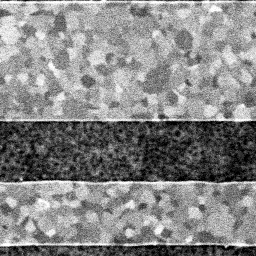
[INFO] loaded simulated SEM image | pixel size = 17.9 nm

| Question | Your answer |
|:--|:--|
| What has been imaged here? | one or a few lines or trenches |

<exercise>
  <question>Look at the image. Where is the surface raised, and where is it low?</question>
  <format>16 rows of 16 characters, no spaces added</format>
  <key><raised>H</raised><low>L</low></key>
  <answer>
HHHHHHHHHHHHHHHH
HHHHHHHHHHHHHHHH
HHHHHHHHHHHHHHHH
HHHHHHHHHHHHHHHH
HHHHHHHHHHHHHHHH
HHHHHHHHHHHHHHHH
HHHHHHHHHHHHHHHH
LLLLLLHHHLLLLLLL
LLLLLLLLLLLLLLLL
LLLLLLLLLLLLLLLL
LLLLLLLLLLLLLLLL
HHHHHHHHHHHHHHHH
HHHHHHHHHHHHHHHH
HHHHHHHHHHHHHHHH
HHHHHHHHHHHHHHHH
LLLLLLLLLLLLLLLL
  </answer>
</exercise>